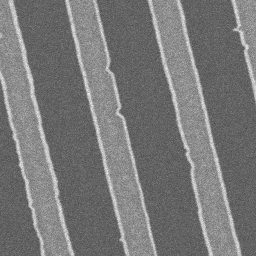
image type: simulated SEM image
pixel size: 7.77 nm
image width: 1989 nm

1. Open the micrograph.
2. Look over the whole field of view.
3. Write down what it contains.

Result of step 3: one or a few lines or trenches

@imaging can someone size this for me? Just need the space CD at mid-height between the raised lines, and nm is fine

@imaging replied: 415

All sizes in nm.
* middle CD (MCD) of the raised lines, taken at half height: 212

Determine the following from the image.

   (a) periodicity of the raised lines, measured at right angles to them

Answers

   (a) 633 nm